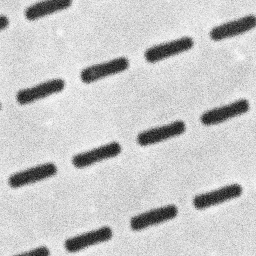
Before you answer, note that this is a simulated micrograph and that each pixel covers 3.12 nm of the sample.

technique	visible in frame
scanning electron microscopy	a regular array of holes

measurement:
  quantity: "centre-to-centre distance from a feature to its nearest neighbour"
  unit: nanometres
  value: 210